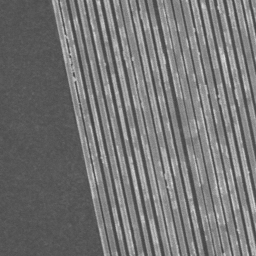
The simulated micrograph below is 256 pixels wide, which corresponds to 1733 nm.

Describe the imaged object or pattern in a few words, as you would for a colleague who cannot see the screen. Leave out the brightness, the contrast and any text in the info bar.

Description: parallel lines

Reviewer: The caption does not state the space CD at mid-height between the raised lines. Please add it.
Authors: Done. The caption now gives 0.0257 micrometres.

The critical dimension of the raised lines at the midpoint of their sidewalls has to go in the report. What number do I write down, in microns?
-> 0.0381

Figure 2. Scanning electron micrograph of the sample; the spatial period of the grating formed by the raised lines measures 0.0575 µm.